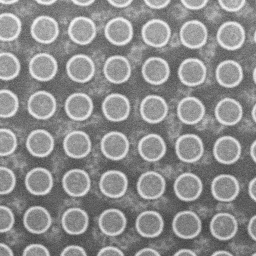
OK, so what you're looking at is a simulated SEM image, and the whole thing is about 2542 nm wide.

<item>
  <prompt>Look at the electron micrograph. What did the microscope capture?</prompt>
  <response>a regular array of raised bodies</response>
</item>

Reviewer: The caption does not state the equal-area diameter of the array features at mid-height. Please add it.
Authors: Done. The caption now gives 254 nanometers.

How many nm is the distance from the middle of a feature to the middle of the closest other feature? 369